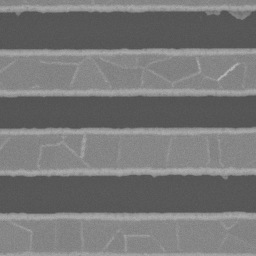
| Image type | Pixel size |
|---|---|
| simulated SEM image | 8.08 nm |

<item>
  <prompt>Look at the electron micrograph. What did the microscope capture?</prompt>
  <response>lines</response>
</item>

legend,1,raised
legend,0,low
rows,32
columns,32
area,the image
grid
11111111111111111111111111111111
00000000000000000000000000000000
00000000000000000000000000000000
00000000000000000000000000000000
00000000000000000000000000000000
00000000000000000000000000000000
11111111111111111111111111111111
11111111111111111111111111111111
11111111111111111111111111111111
11111111111111111111111111111111
11111111111111111111111111111111
11111111111111111111111111111111
00000000000000000000000000000000
00000000000000000000000000000000
00000000000000000000000000000000
00000000000000000000000000000000
11111111111111111111111111111111
11111111111111111111111111111111
11111111111111111111111111111111
11111111111111111111111111111111
11111111111111111111111111111111
11111111111111111111111111111111
00000000000000000000000000000000
00000000000000000000000000000000
00000000000000000000000000000000
00000000000000000000000000000000
00000000000000000000000000000000
11111111111111111111111111111111
11111111111111111111111111111111
11111111111111111111111111111111
11111111111111111111111111111111
11111111111111111111111111111111